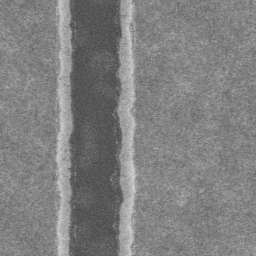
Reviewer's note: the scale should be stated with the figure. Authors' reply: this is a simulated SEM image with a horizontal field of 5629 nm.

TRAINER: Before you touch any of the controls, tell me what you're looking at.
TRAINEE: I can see one or a few lines or trenches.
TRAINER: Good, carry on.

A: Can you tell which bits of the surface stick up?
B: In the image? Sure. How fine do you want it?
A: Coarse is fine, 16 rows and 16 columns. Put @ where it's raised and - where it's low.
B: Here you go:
@@@@----@@@@@@@@
@@@@----@@@@@@@@
@@@@----@@@@@@@@
@@@@----@@@@@@@@
@@@@----@@@@@@@@
@@@@----@@@@@@@@
@@@@----@@@@@@@@
@@@@----@@@@@@@@
@@@@----@@@@@@@@
@@@@----@@@@@@@@
@@@@----@@@@@@@@
@@@@----@@@@@@@@
@@@@----@@@@@@@@
@@@@----@@@@@@@@
@@@@----@@@@@@@@
@@@@----@@@@@@@@